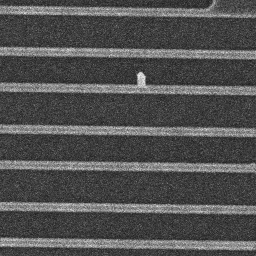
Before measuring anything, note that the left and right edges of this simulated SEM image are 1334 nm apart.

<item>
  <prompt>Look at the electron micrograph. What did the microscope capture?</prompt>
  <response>parallel lines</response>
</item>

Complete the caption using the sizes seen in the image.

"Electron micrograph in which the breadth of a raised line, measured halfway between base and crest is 0.0358 microns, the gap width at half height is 179 nanometers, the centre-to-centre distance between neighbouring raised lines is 201 nm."